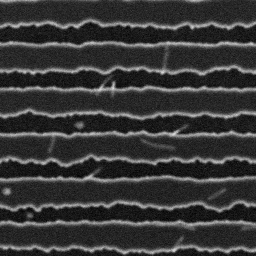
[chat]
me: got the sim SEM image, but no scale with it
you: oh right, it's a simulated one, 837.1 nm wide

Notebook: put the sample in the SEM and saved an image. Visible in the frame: lines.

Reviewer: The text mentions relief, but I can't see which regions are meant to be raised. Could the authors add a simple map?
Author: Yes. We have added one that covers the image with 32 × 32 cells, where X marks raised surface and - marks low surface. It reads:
XXXXXXXXXXXXXXXXXXXXXXXXXXXXXXXX
XXXXXXXXXXXXXXXXXXXXXXXXXXXXXXXX
XXXXXXXXXXXXXXXXXXXXXXXXXXXXXXXX
--------------------XX--X---X---
--------------------------------
XXXX--XX--XXXXXX---XXXXX---XXX-X
XXXXXXXXXXXXXXXXXXXXXXXXXXXXXXXX
XXXXXXXXXXXXXXXXXXXXXXXXXXXXXXXX
XXXXXXXXXXXXXXXXXXXXXXXXXXXXXXXX
--------------------------------
--------------------------------
XXXXXXXXXXXXXXXXXXXXXXXXXXXXXXXX
XXXXXXXXXXXXXXXXXXXXXXXXXXXXXXXX
XXXXXXXXXXXXXXXXXXXXXXXXXXXXXXXX
XX----XX------X-XXXX----X-XXX---
--------------------------------
-----------------X--------------
XXXXXXXXXXXXXXXXXXXXXXXXXXXXXXXX
XXXXXXXXXXXXXXXXXXXXXXXXXXXXXXXX
XXXXXXXXXXXXXXXXXXXXXXXXXXXXXXXX
-----X-XX-----------------------
--------------------------------
XXXXXXXXXXXXXXXXXXXXXXXXXXXXXXXX
XXXXXXXXXXXXXXXXXXXXXXXXXXXXXXXX
XXXXXXXXXXXXXXXXXXXXXXXXXXXXXXXX
XXXXXXXXXXXXXX--XXXXXXXXXXXXXXXX
--------------------------------
--------------------------------
XXXXXXXXXXXXXXXXXXXXXXXXXXXXXXXX
XXXXXXXXXXXXXXXXXXXXXXXXXXXXXXXX
XXXXXXXXXXXXXXXXXXXXXXXXXXXXXXXX
---------------X--XX--------X---